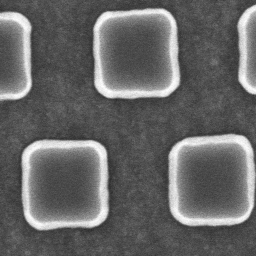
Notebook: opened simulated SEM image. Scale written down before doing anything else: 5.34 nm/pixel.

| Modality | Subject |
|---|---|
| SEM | raised bodies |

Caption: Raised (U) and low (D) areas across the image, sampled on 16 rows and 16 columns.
DDDDDDDDDDDDDDDD
UDDDDDUUUUUDDDDU
UUDDDDUUUUUDDDDU
UUDDDDUUUUUDDDDU
UUDDDDUUUUUDDDDU
UUDDDDUUUUUDDDDD
DDDDDDDDDDDDDDDD
DDDDDDDDDDDDDDDD
DDDDDDDDDDDDDDDD
DDUUUUDDDDDUUUUU
DDUUUUUDDDDUUUUU
DDUUUUUDDDDUUUUU
DDUUUUUDDDDUUUUU
DDUUUUDDDDDUUUUD
DDDDDDDDDDDDDDDD
DDDDDDDDDDDDDDDD